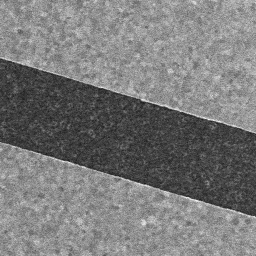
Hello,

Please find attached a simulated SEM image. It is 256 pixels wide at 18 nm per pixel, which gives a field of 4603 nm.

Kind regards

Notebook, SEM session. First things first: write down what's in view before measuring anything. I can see one or a few lines or trenches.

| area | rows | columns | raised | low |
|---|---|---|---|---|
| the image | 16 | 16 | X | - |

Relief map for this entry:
XXXXXXXXXXXXXXXX
XXXXXXXXXXXXXXXX
XXXXXXXXXXXXXXXX
XXXXXXXXXXXXXXXX
---XXXXXXXXXXXXX
------XXXXXXXXXX
----------XXXXXX
-------------XXX
----------------
XX--------------
XXXXX-----------
XXXXXXXXX-------
XXXXXXXXXXXX----
XXXXXXXXXXXXXXXX
XXXXXXXXXXXXXXXX
XXXXXXXXXXXXXXXX